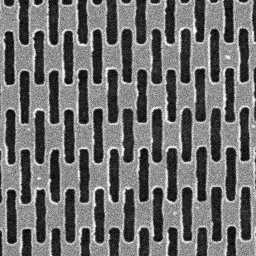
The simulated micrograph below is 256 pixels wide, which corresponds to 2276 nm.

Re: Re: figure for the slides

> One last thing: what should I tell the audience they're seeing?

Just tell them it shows a regular array of holes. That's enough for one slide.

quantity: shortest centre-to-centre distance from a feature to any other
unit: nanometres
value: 258